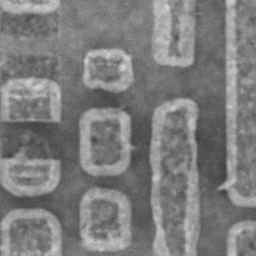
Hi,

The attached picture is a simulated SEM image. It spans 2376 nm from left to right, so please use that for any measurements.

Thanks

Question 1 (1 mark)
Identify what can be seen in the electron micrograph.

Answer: one or a few lines or trenches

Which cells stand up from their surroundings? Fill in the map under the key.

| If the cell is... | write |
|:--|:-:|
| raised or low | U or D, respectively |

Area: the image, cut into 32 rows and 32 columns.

DUUUUUDDDDDDDDDDDDDDUUUDDDDDDUUU
DDDDDDDDDDDDDDDDDDDDUUUUDDDDDUUU
DDDDDDDDDDDDDDDDDDDDUUUDDDDDDUUU
DDDDDDDDDDDDDDDDDDDDUUUDDDDDDUUU
DDDDDDDDDDDDDDDDDDDDUUUDDDDDDUUU
DDDDDDDDDDDDDDDDDDDDUUUDDDDDDUUU
DDDDDDDDDDDDDDDDDDDDUUUUDDDDDUUU
DDDDDDDDDDDUUUUUDDDDUUUUDDDDDUUU
DDDDDDDDDDDUUUUUDDDDDDDDDDDDDUUU
DDDDDDDDDDDUUUUUDDDDDDDDDDDDDUUU
DDDDUUDDDDDUUUUDDDDDDDDDDDDDDUUU
DUUUUUUDDDDDDDDDDDDDDDDDDDDDDUUU
DUUUUUUDDDDDDDDDDDDDDDDDDDDDDUUU
DUUUUUUDDDDDDDDDDDDDDUUUDDDDDUUU
DUUUUUUDDDDUUUUDDDDDUUUUDDDDDUUU
DDDDDDDDDDDUUUUUDDDUUUUUDDDDDUUU
DDDDDDDDDDDUUUUUDDDUUUUUDDDDDUUU
DDDDDDDDDDDUUUUUDDDUUUUUDDDDDUUU
DDDDDDDDDDDUUUUUDDDUUUUUDDDDDUUU
DDDDDDDDDDDUUUUUDDDUUUUUDDDDDUUU
DUUUUUUDDDDUUUUDDDDUUUUUDDDDDUUU
DUUUUUUDDDDDDDDDDDDUUUUUDDDDDUUU
DUUUUUUDDDDDDDDDDDDUUUUUDDDDDUUU
DDUUUUDDDDDDDDDDDDDUUUUUDDDDUUUU
DDDDDDDDDDDUUUDDDDDUUUUUDDDDDUUU
DDDDDDDDDDDUUUUUDDDUUUUUDDDDDDDD
DDDDDDDDDDDUUUUUDDDDUUUUDDDDDDDD
DUUUUUDDDDDUUUUUDDDDUUUUDDDDDDDD
DUUUUUUDDDUUUUUUDDDDUUUUDDDDDDUU
DUUUUUUDDDDUUUUDDDDDUUUUDDDDDUUU
DUUUUUUDDDDUUDDDDDDDUUUUDDDDDUUU
DUUUUUUDDDDDDDDDDDDDUUUUDDDDDUUU